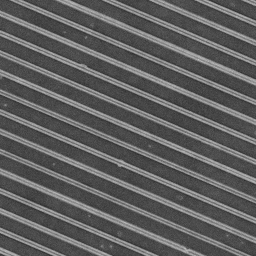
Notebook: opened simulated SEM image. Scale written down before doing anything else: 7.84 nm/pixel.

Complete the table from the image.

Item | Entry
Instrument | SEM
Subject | parallel lines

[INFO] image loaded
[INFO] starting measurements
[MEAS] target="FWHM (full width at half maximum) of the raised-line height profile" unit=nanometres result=28.9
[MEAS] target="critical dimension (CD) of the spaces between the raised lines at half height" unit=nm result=110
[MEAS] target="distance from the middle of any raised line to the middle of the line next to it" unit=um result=0.142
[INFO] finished